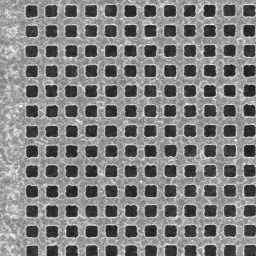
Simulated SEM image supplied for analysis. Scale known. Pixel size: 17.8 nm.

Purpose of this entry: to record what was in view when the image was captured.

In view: a regular array of holes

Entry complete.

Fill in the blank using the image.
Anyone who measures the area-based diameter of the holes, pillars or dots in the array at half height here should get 0.243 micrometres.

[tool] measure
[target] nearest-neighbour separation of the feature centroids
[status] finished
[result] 350 nm